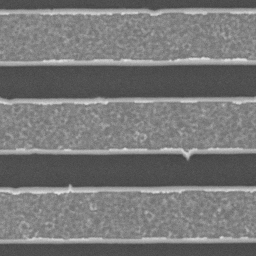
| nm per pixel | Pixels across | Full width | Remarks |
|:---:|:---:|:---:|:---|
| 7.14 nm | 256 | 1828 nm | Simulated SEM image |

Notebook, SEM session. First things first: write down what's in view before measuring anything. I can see one or a few lines or trenches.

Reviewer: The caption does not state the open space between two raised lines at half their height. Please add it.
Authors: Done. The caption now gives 36.3 px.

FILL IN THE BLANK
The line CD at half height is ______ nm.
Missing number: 378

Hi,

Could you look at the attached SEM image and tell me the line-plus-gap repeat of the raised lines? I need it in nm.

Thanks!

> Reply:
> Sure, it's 636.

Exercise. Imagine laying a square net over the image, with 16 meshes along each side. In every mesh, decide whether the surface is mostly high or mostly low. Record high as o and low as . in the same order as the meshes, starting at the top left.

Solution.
................
oooooooooooooooo
oooooooooooooooo
oooooooooooooooo
................
................
oooooooooooooooo
oooooooooooooooo
oooooooooooooooo
ooooooo....oo...
................
................
oooooooooooooooo
oooooooooooooooo
oooooooooooooooo
................